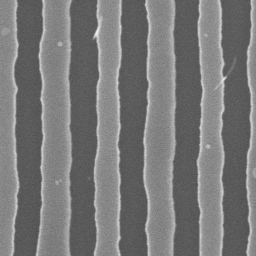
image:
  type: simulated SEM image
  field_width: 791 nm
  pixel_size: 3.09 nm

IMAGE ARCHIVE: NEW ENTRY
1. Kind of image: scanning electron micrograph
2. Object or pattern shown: lines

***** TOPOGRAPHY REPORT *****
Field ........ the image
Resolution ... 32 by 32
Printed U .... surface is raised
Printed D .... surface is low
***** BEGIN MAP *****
UUDDDUUUUDDDUUUDDDUUUUDDDUUUDDDU
UUDDDUUUUDDDUUUDDDUUUUDDDUUUDDDU
UUDDDUUUUDDDUUUDDDDUUUDDDUUUDDDU
UUDDDUUUUDDDUUUDDDDUUUDDDUUUDDDU
UUDDDUUUUDDDUUUDDDDUUUDDDUUUDDDU
UUDDDUUUUDDDUUUDDDDUUUDDDUUUDDDU
UUDDDUUUUDDDUUUDDDDUUUDDDUUUDDDU
UUDDDUUUUDDDUUUDDDUUUUDDDUUUDDDU
UUDDDUUUUDDDUUUDDDUUUUDDDUUUDDDU
UUDDDUUUUDDDUUUDDDUUUUDDDUUUDDDU
UUDDDUUUUDDDUUUDDDDUUUDDDUUUDDDU
UUDDDUUUUDDDUUUDDDDUUUDDDUUUDDDU
UUDDDUUUUDDDUUUDDDDUUUDDDUUUDDDU
UUDDDUUUUDDDUUUDDDUUUUDDDUUUDDDU
UUDDDUUUUDDDUUUDDDUUUUDDDUUUDDDU
UUDDDUUUUDDDUUUDDDUUUUDDDUUUDDDU
UUDDDUUUUDDDUUUDDDUUUUDDDUUUDDDU
UUDDDUUUUDDDUUUDDDUUUUDDDUUUDDDU
UUDDDUUUUDDDUUUDDDUUUUDDDUUUDDDU
UUDDDUUUUDDDUUUDDDUUUUDDDUUUDDDU
UUDDDUUUUDDDUUUDDDUUUDDDDUUUDDDU
UUDDDUUUUDDDUUUDDDUUUDDDDUUUDDDU
UUDDDUUUUDDDUUUDDDUUUDDDDUUUDDDU
UUDDDUUUUDDDUUUDDDUUUDDDDUUUDDDU
UUDDDUUUUDDDUUUDDDUUUDDDDUUUDDDU
UUDDDUUUUDDDUUUDDDDUUUDDDUUUDDDU
UUDDDUUUUDDDUUUDDDDUUUDDDUUUDDDU
UUDDDUUUUDDDUUUDDDUUUUDDDUUUDDDU
UUDDDUUUUDDDUUUDDDUUUUDDDUUUDDDU
UUDDDUUUUDDDUUUDDDUUUUDDDUUUDDDU
UUDDDUUUUDDDUUUDDDUUUDDDDUUUDDDU
UUDDDUUUUDDDUUUDDDDUUDDDDUUUDDDU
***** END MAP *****